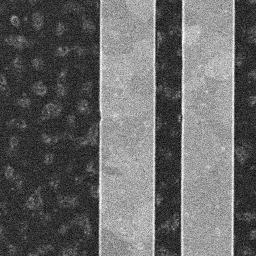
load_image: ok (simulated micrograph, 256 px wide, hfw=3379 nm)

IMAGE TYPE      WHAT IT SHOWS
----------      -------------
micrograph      one or a few lines or trenches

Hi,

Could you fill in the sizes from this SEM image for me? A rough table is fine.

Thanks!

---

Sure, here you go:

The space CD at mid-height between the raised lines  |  0.363 µm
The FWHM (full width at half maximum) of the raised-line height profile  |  697 nm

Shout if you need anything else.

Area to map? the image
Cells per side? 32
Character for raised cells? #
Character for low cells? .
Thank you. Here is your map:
.............######....######...
.............######....######...
.............######....######...
.............######....######...
.............######....######...
..#..........######....######...
.............######....######...
.............######....######...
.............######....######...
.............######....######...
.............######....######...
.............######....######...
.............######....######...
.............######....######...
.............######....######...
.............######....######...
...........########....######...
.............######....######...
.............######....######...
.............######....######...
.............######....######...
.............######....######...
.............######....######...
.............######....######...
.............######....######...
.............######....######...
............#######....######...
............#######....######...
............#######....######...
............#######....######...
............#######....######...
............#######....######...